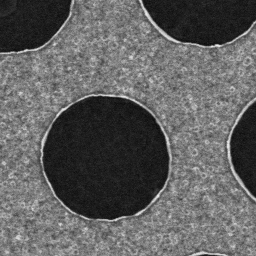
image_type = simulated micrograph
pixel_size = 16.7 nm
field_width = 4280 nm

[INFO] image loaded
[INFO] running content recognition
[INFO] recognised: holes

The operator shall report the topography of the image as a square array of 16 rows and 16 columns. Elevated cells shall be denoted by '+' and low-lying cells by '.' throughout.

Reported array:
....+++++.......
....++++++......
...++++++++....+
++++++++++++++++
++++++++++++++++
++++++++++++++++
+++++....+++++++
+++.......+++++.
+++.......++++..
+++........+++..
+++........++++.
+++.......+++++.
++++......++++++
+++++...++++++++
++++++++++++++++
++++++++++++++++